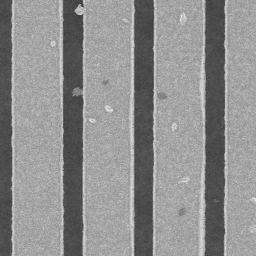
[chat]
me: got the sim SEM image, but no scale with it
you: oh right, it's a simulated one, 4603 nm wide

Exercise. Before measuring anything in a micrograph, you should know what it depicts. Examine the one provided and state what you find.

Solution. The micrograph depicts lines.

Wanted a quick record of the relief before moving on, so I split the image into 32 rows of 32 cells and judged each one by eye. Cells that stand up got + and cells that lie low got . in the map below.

..++++++..+++++++..++++++...++++
..++++++..+++++++..++++++...++++
..++++++..+++++++..++++++...++++
..++++++...++++++..++++++...++++
..++++++...++++++..++++++...++++
..++++++..+++++++..++++++...++++
..++++++...++++++..++++++...++++
..++++++..+++++++..++++++...++++
..++++++...++++++..++++++...++++
..++++++...++++++..++++++...++++
..++++++...++++++..++++++...++++
..++++++..+++++++..++++++...++++
..++++++..+++++++..++++++...++++
..++++++..+++++++..++++++...++++
..++++++..+++++++..++++++...++++
..++++++..+++++++..++++++...++++
..++++++..+++++++..++++++...++++
..++++++..+++++++..+++++++..++++
..++++++..+++++++..++++++...++++
..++++++..+++++++..++++++...++++
..++++++..+++++++..++++++...++++
..++++++..+++++++..++++++...++++
..++++++..+++++++..++++++...++++
..++++++..+++++++..++++++...++++
..++++++..+++++++..++++++...++++
..++++++..+++++++..++++++...++++
..++++++..+++++++..++++++...++++
..++++++..+++++++..++++++...++++
..++++++...++++++..++++++...++++
..++++++..+++++++..++++++...++++
..++++++..+++++++..++++++...++++
..++++++..+++++++..++++++...++++